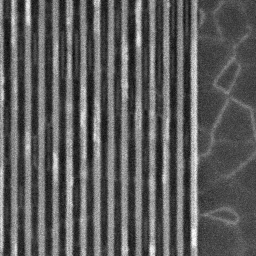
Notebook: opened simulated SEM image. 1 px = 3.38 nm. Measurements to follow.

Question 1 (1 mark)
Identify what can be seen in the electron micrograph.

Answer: parallel lines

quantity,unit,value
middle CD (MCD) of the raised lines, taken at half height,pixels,5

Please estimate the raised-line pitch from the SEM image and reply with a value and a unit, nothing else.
46.6 nm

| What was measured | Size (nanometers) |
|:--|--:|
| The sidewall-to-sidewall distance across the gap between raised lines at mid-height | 30.4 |